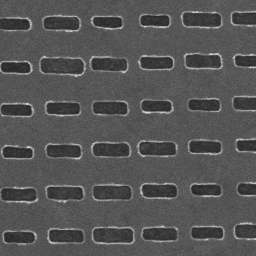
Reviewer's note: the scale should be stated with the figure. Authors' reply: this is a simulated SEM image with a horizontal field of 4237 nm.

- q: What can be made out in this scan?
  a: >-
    a regular array of holes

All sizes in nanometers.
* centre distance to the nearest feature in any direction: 702